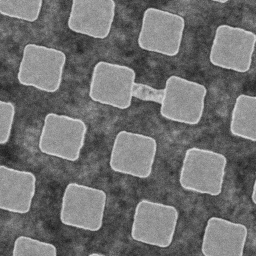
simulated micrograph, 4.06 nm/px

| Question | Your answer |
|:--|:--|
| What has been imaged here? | a regular array of raised bodies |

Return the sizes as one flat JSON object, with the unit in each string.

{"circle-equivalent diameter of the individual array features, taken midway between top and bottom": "184 nanometers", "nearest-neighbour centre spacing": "292 nm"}